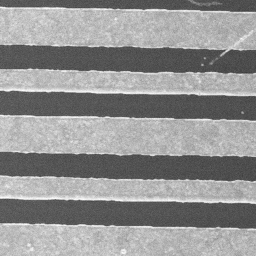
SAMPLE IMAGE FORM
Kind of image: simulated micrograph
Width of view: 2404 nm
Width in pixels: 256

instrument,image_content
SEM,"lines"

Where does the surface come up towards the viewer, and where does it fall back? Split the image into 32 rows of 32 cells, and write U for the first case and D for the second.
DDDDDDDDDDDDDDDDDDDDDDDDDDDDDDDD
UUUUUUUUUUUUUUUUUUUUUUUUUUUUUDDD
UUUUUUUUUUUUUUUUUUUUUUUUUUUUUUUU
UUUUUUUUUUUUUUUUUUUUUUUUUUUUUUUU
UUUUUUUUUUUUUUUUUUUUUUUUUUUUUUUU
UUDUUUUUUUUUUUUUUUUUUUUUUUUUUUUU
DDDDDDDDDDDDDDDDDDDDDDDDDDDDDDDD
DDDDDDDDDDDDDDDDDDDDDDDDDDDDDDDD
DDDDDDDDDDDDDDDDDDDDDDDDDDDDDDDD
UUUUUUUUUUUUUUUUUUUUUUUUUUUUUUUU
UUUUUUUUUUUUUUUUUUUUUUUUUUUUUUUU
DDDDDDDDDDDDDDDUUUUUUUUUUUUUUUUU
DDDDDDDDDDDDDDDDDDDDDDDDDDDDDDDD
DDDDDDDDDDDDDDDDDDDDDDDDDDDDDDDD
DDDDDDDDDDDDDDDDDDDDDDDDDDDDDDDD
UUUUUUUUUUUUUUUUUUUUUUUUUUUUUUUU
UUUUUUUUUUUUUUUUUUUUUUUUUUUUUUUU
UUUUUUUUUUUUUUUUUUUUUUUUUUUUUUUU
UUUUUUUUUUUUUUUUUUUUUUUUUUUUUUUU
DDDDDDDDDDDDDDDDDDDDDDDDDDDUDDUU
DDDDDDDDDDDDDDDDDDDDDDDDDDDDDDDD
DDDDDDDDDDDDDDDDDDDDDDDDDDDDDDDD
UUUUUUUUUUUUUUUUUUUUUDDUUDDDDDDD
UUUUUUUUUUUUUUUUUUUUUUUUUUUUUUUU
UUUUUUUUUUUUUUUUUUUUUUUUUUUUUUUU
DDDDDDDDDDDDDDDDDDDDDDDDDDDDDDDD
DDDDDDDDDDDDDDDDDDDDDDDDDDDDDDDD
DDDDDDDDDDDDDDDDDDDDDDDDDDDDDDDD
UUUUUUUUUUUUUUUUUUUUUUUUUDDDDDDD
UUUUUUUUUUUUUUUUUUUUUUUUUUUUUUUU
UUUUUUUUUUUUUUUUUUUUUUUUUUUUUUUU
UUUUUUUUUUUUUUUUUUUUUUUUUUUUUUUU